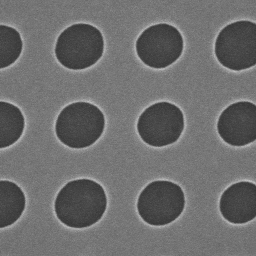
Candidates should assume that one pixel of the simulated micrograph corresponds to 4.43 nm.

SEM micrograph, holes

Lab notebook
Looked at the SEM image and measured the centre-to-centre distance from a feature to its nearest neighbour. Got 348 nm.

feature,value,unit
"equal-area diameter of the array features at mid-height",0.211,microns